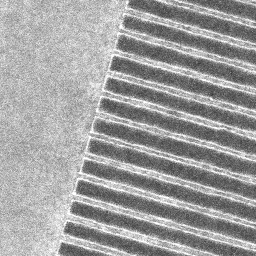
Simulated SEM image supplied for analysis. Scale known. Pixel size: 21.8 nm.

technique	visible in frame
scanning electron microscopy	parallel lines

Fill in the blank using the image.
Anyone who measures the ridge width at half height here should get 370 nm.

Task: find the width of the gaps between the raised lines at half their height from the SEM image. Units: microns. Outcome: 0.097